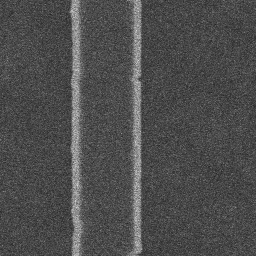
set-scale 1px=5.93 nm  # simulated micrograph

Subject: one or a few lines or trenches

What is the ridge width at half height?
366 nanometers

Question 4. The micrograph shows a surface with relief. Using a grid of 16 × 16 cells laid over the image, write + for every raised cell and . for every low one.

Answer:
.....++++.......
.....++++.......
.....++++.......
.....++++.......
.....++++.......
.....++++.......
.....++++.......
.....++++.......
.....++++.......
.....++++.......
.....++++.......
.....++++.......
.....++++.......
.....++++.......
.....++++.......
.....++++.......